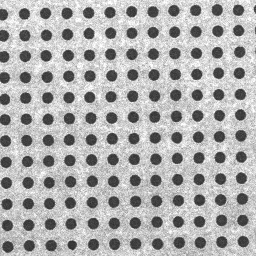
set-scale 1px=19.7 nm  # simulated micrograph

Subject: a regular array of holes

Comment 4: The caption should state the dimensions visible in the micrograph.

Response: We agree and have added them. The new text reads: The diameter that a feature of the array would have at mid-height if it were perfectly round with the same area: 226 nm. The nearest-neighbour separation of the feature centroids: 410 nm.